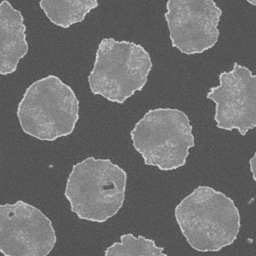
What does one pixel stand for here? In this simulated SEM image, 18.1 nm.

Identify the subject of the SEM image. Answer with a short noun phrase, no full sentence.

raised bodies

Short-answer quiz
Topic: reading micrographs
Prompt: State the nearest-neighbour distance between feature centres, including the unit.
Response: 1470 nm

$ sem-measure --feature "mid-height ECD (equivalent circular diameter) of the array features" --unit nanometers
1080